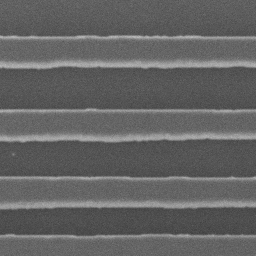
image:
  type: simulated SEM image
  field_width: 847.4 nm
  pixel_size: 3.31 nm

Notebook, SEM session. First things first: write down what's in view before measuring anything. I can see lines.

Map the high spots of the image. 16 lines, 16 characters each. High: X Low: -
----------------
----------------
XXXXXXXXXXXXXXXX
XXXXXXXXXXXXXXXX
----------------
----------------
----------------
XXXXXXXXXXXXXXXX
XXXXXXXXXXXXXXXX
----------------
----------------
XXXXXXXXXXXXXXXX
XXXXXXXXXXXXXXXX
----------------
----------------
XXXXXXXXXXXXXXXX